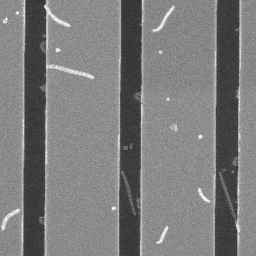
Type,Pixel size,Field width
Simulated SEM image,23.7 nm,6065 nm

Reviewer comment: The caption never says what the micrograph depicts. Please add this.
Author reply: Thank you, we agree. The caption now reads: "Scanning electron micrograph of lines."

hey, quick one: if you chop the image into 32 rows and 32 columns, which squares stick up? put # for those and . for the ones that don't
###...#########...#########...##
###...#########...#########...##
###...#########...#########...##
###...#########...#########...##
###...#########...#########...##
###...#########...#########...##
###...#########...#########...##
###...#########...#########...##
###...#########...#########...##
###...#########...#########...##
###...#########...#########...##
###...#########...#########...##
###...#########...#########...##
###...#########...#########...##
###...#########...#########...##
###...#########...#########...##
###...#########...#########...##
###...#########...#########...##
###...#########...#########...##
###...#########...#########...##
###...#########...#########...##
###...#########...#########...##
###...#########...#########...##
###...#########...#########...##
###...#########...#########...##
###...#########...#########...##
###...#########...#########...##
###...#########...#########...##
###...#########...#########...##
###...#########...#########...##
###...#########...#########...##
###...#########...#########...##